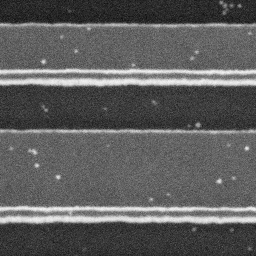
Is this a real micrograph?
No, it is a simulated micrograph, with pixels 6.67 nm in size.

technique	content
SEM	lines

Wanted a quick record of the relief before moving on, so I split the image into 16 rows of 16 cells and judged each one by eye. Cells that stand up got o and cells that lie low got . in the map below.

................
................
oooooooooooooooo
oooooooooooooooo
oooooooooooooooo
................
................
................
oooooooooooooooo
oooooooooooooooo
oooooooooooooooo
oooooooooooooooo
oooooooooooooooo
oooooooooooooooo
................
................